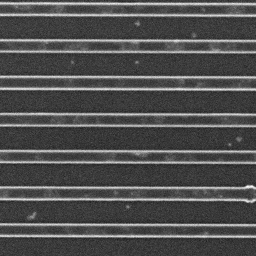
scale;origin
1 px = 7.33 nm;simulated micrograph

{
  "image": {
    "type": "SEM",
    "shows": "parallel lines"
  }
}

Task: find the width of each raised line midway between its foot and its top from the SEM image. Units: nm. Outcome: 90.7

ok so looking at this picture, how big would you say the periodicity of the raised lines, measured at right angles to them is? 270 nanometres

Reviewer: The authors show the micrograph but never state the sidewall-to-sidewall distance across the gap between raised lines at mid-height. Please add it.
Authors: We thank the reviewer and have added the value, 181 nm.